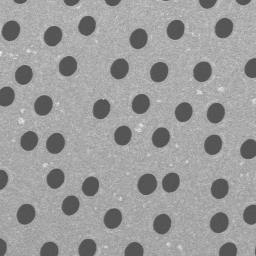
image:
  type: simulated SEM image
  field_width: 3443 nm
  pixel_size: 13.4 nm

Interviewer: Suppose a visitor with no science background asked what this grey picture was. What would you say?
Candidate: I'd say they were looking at a regular array of holes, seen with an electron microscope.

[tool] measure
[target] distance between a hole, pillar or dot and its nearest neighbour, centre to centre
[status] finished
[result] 463 nm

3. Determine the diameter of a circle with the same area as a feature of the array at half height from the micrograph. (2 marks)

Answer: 0.259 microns